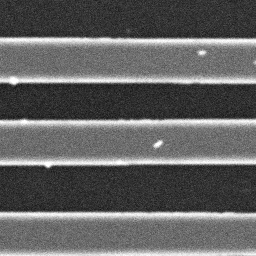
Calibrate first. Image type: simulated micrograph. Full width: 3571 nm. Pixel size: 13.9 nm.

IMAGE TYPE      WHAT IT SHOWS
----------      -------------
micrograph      lines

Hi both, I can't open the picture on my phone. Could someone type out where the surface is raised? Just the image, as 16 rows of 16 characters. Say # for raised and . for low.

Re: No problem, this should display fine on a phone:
................
................
################
################
################
................
................
................
################
################
................
................
................
################
################
################